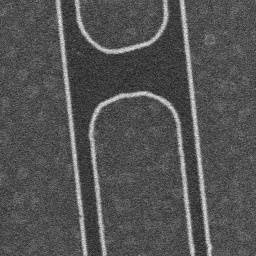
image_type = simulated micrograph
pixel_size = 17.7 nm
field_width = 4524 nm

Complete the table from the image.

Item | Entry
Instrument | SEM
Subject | one or a few lines or trenches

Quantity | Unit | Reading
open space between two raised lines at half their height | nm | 1550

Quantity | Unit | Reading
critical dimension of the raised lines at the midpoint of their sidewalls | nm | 338